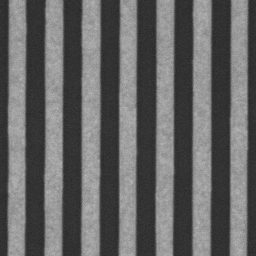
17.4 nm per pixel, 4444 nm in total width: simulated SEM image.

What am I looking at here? wiring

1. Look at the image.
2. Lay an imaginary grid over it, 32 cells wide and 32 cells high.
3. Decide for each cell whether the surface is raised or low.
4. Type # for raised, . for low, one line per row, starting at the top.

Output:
.##...##..##...##...##..##...##.
.##...##..##...##...##..##...##.
.##...##..##...##...##..##...##.
.##...##..##...##...##..##...##.
.##...##..##...##...##..##...##.
.##...##..##...##...##..##...##.
.##...##..##...##...##..##...##.
.##...##..##...##...##..##...##.
.##...##..##...##...##..##...##.
.##...##..##...##...##..##...##.
.##...##..##...##...##..##...##.
.##...##..##...##...##..##...##.
.##...##..##...##...##..##...##.
.##...##..##...##...##..##...##.
.##...##..##...##...##..##...##.
.##...##..##...##...##..##...##.
.##...##..##...##...##..##...##.
.##...##..##...##...##..##...##.
.##...##..##...##...##..##...##.
.##...##..##...##...##..##...##.
.##...##..##...##...##..##...##.
.##...##..##...##...##..##...##.
.##...##..##...##...##..##...##.
.##...##..##...##...##..##...##.
.##...##..##...##...##..##...##.
.##...##..##...##...##..##...##.
.##...##..##...##...##..##...##.
.##...##..##...##...##..##...##.
.##...##..##...##...##..##...##.
.##...##..##...##...##..##...##.
.##...##..##...##...##..##...##.
.##...##..##...##...##..##...##.